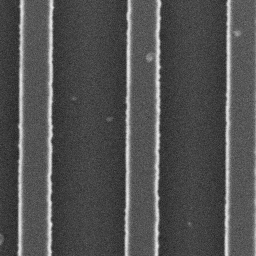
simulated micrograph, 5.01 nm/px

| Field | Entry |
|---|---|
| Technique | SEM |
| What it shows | lines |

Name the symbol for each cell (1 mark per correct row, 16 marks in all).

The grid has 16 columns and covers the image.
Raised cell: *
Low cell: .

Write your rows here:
.**.....**....**
.**.....**....**
.**.....**....**
.**.....**....**
.**.....**....**
.**.....**....**
.**.....**....**
.**.....**....**
.**.....**....**
.**.....**....**
.**.....**....**
.**.....**....**
.**.....**....**
.**.....**....**
.**.....**....**
.**.....**....**